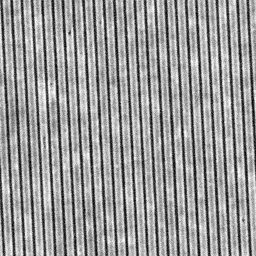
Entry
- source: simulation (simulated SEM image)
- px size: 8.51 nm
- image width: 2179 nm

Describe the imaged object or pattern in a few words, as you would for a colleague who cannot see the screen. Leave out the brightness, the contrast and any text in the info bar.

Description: parallel lines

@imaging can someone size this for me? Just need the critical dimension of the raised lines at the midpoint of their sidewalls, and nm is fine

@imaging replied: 58.4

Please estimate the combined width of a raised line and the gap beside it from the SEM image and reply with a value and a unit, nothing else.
10.2 pixels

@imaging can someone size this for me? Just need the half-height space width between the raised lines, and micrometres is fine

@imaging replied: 0.0287